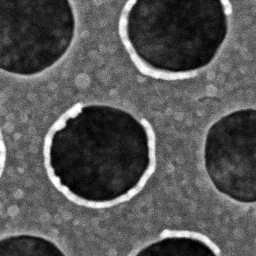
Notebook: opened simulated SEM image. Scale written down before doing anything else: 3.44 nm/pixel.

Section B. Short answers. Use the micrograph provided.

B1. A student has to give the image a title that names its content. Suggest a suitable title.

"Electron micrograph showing holes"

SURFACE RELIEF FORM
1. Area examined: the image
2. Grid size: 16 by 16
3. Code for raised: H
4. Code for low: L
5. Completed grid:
LLLLHHHHLLLLLLHH
LLLLLHHHLLLLLLHH
LLLLHHHHLLLLLLHH
LLLLHHHHHLLLLHHH
HLHHHHHHHHHHHHHH
HHHHHHHHHHHHHHHH
HHHHHHHHHHHHHHHH
HHHHLLLLLHHHHHLL
HHHLLLLLLHHHHLLL
HHHLLLLLLHHHHLLL
HHHLLLLLLHHHHLLL
HHHHLLLLLHHHHLLL
HHHHHHLHHHHHHHHL
HHHHHHHHHHHHHHHH
HHHHHHHHHHHHHHHH
LLLLHHHHHLLLLHHH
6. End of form